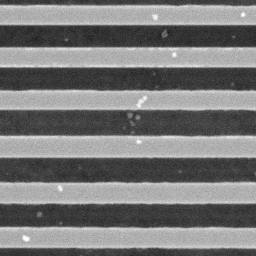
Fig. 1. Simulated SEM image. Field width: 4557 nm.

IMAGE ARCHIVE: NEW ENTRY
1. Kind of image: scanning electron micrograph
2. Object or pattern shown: lines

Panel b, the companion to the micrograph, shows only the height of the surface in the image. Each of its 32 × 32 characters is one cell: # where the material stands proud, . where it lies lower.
................................
################################
################################
................................
................................
................................
################################
################################
................................
................................
................................
################################
################################
################################
................................
................................
................................
################################
################################
################################
................................
................................
................................
################################
################################
................................
................................
................................
############.##...........###...
################################
################################
................................